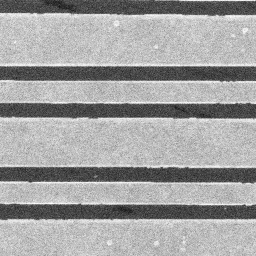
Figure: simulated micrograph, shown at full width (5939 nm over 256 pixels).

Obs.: lines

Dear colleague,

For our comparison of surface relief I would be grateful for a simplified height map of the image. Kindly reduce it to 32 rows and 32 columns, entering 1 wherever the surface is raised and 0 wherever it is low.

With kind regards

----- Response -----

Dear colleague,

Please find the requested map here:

00000000000000000000000000000000
00000000000000000000000000000000
11111111111111111111111111111111
11111111111111111111111111111111
11111111111111111111111111111111
11111111111111111111111111111111
11111111111111111111111111111111
11111111111111111111111111111111
00000000000000000000000000000000
00000000000000000000000000000000
11111111111111111111111111111111
11111111111111111111111111111111
11111111111111111111111111111111
00000000000000000000000000000000
00000000000000000000000000000000
11111111111111111111111111111111
11111111111111111111111111111111
11111111111111111111111111111111
11111111111111111111111111111111
11111111111111111111111111111111
11111111111111111111111111111111
00000000000000000000000000000000
00000000000000000000000000000000
11111111111111111111111111111111
11111111111111111111111111111111
00000000000000000000000000000000
00000000000000000000000000000000
00000000000000000000000000000000
11111111111111111111111111111111
11111111111111111111111111111111
11111111111111111111111111111111
11111111111111111111111111111111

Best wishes